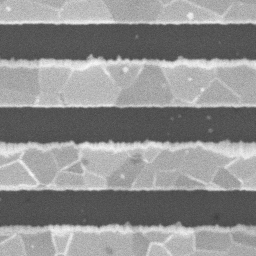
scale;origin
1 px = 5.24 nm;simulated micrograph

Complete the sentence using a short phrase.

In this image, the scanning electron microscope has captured lines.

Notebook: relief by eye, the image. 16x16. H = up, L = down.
HHHHHHHHHHHHHHHH
LHLLHLLLLHHHLLLL
LLLLLLLLLLLLLLLL
LLLLLLLLLLLLLLLL
HHHHHHHHHHHHHHHH
HHHHHHHHHHHHHHHH
HHHHHHHHHHHHHHHH
LLLLLLLLLLLLLLLL
LLLLLLLLLLLLLLLL
HHHHHHHHHHHHHHHH
HHHHHHHHHHHHHHHH
HHHHHHHHHHHHHHHH
LLLLLLLLLLLLLLLL
LLLLLLLLLLLLLLLL
HHHHHHHHHHHHHHHH
HHHHHHHHHHHHHHHH